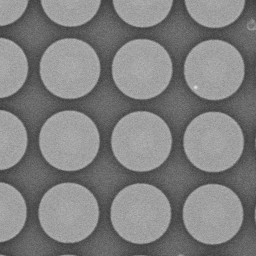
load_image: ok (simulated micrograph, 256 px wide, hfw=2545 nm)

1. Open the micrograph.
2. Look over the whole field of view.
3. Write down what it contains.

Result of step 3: an array of small figures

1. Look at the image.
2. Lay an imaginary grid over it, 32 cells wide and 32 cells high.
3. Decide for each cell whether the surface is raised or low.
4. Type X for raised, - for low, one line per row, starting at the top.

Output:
XXX--XXXXXXX--XXXXXXX--XXXXXXXX-
XXX---XXXXXX---XXXXXX---XXXXXX--
XX-----XXXX----XXXXX----XXXXX---
--------------------------------
--------------------------------
XX-----XXXX-----XXXX-----XXXX---
XXX---XXXXXX---XXXXXX---XXXXXX--
XXX--XXXXXXX--XXXXXXX--XXXXXXX--
XXX--XXXXXXX--XXXXXXX--XXXXXXX--
XXX--XXXXXXX--XXXXXXX--XXXXXXX--
XXX---XXXXXX---XXXXXX--XXXXXXX--
XX----XXXXX----XXXXX----XXXXX---
--------------------------------
--------------------------------
XX-----XXXX-----XXXX-----XXX----
XXX---XXXXXX---XXXXXX---XXXXXX--
XXX--XXXXXXX--XXXXXXX--XXXXXXX--
XXX--XXXXXXX--XXXXXXX--XXXXXXX--
XXX--XXXXXXX--XXXXXXX--XXXXXXX--
XXX--XXXXXXX--XXXXXXX--XXXXXXX--
XX----XXXXX----XXXXX----XXXXX---
--------------------------------
--------------------------------
XX-----XXXX-----XXXX-----XXX----
XXX---XXXXXX---XXXXXX---XXXXXX--
XXX--XXXXXXX--XXXXXXX--XXXXXXX--
XXX--XXXXXXX--XXXXXXX--XXXXXXX--
XXX--XXXXXXX--XXXXXXX--XXXXXXX--
XXX--XXXXXXX--XXXXXXX--XXXXXXX--
XX----XXXXX----XXXXX----XXXXX---
--------------------------------
--------------------------------